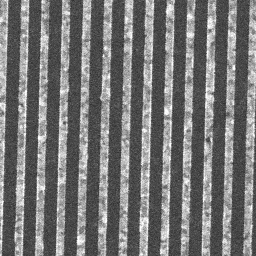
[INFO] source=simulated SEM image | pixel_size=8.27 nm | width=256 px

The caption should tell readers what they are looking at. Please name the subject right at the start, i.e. parallel lines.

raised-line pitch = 0.172 um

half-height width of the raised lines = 0.062 microns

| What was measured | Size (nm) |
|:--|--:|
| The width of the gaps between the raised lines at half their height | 111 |